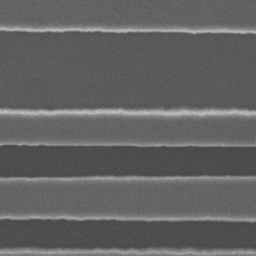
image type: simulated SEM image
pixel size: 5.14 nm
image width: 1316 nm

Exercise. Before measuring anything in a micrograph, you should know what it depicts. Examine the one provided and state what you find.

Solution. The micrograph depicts lines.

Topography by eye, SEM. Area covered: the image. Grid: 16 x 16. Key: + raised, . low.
++++++++++++++++
++++++++++++++++
................
................
................
................
................
++++++++++++++++
++++++++++++++++
................
................
++++++++++++++++
++++++++++++++++
++++++++++++++++
................
................